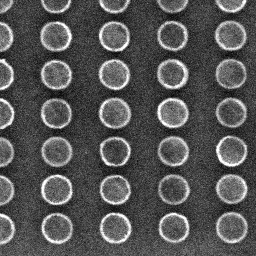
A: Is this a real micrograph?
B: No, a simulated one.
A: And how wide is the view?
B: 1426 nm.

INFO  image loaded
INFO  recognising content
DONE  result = a regular array of raised bodies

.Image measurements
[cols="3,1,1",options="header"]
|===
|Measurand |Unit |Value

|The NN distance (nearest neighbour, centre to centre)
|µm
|0.212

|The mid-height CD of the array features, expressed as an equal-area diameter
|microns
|0.163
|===